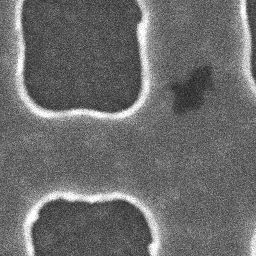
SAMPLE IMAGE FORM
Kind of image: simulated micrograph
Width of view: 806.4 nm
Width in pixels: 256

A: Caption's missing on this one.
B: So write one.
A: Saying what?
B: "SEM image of holes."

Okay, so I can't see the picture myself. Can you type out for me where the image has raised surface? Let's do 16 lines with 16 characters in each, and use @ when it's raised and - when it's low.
@--------@@@@@@-
@--------@@@@@@@
@--------@@@@@@@
@--------@@@@@@@
@--------@@@@@@@
@@-------@@@@@@@
@@------@@@@@@@@
@@@@@@@@@@@@@@@@
@@@@@@@@@@@@@@@@
@@@@@@@@@@@@@@@@
@@@@@@@@@@@@@@@@
@@@@@@@@@@@@@@@@
@@@-@@--@@@@@@@@
@@-------@@@@@@@
@@--------@@@@@@
@@-------@@@@@@@